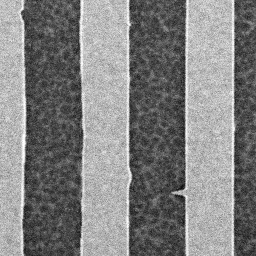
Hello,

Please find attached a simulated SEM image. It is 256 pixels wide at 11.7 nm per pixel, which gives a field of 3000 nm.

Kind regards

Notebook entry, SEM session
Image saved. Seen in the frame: one or a few lines or trenches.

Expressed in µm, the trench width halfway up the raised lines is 0.69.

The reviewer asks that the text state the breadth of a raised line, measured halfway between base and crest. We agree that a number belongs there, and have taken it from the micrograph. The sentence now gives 540 nm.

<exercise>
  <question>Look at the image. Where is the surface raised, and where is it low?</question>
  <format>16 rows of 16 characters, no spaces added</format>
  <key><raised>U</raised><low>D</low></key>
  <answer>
UDDDDUUUDDDDUUUD
UDDDDUUUDDDDUUUD
UDDDDUUUDDDDUUUD
UDDDDUUUDDDDUUUD
UDDDDUUUDDDDUUUD
UDDDDUUUDDDDUUUD
UUDDDUUUDDDDUUUD
UUDDDUUUDDDDUUUD
UDDDDUUUDDDDUUUD
UDDDDUUUDDDDUUUD
UDDDDUUUDDDDUUUD
UDDDDUUUDDDDUUUD
UDDDDUUUDDDDUUUD
UDDDDUUUDDDDUUDD
UDDDDUUUDDDDUUUD
UDDDDUUUDDDDUUUD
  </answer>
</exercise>